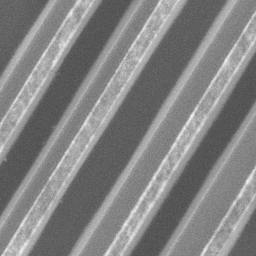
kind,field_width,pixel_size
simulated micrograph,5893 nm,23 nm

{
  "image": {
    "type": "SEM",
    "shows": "lines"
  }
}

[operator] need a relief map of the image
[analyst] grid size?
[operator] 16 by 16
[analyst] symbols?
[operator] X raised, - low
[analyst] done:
---XXX--XXX---XX
---XX---XX----XX
--XX---XXX---XXX
-XXX---XX----XX-
-XX---XX----XXX-
XXX--XXX---XXX--
XX---XX----XXX--
X---XXX---XXX---
X---XX---XXX---X
---XX----XXX--XX
--XXX---XXX---XX
--XX----XX---XXX
-XX----XXX---XXX
XXX---XXX---XXX-
XX----XXX--XXXX-
XX---XXX---XXX--